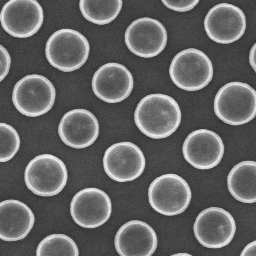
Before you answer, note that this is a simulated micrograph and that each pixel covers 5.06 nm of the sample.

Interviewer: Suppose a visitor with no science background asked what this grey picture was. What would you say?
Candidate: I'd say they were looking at a regular array of raised bodies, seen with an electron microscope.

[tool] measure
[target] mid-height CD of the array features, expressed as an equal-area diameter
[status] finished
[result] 39.1 px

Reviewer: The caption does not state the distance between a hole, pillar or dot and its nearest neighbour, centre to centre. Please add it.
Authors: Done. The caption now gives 0.283 micrometres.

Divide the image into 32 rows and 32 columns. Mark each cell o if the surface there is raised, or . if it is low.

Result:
.oooo.....ooooo......ooo........
ooooo.....ooooo...........oooo..
ooooo......ooo...oo.......ooooo.
.oooo...........oooo......ooooo.
..o....ooo......ooooo.....oooo..
......ooooo.....ooooo...........
o.....ooooo......ooo...oo......o
o.....ooooo...........oooo.....o
o......oo....ooo.....ooooo......
o...o.......oooo.....ooooo......
..oooo......oooo......oooo...o..
..ooooo.....oooo...........ooooo
..ooooo......oo...ooo......ooooo
..oooo...........ooooo.....ooooo
........oooo.....ooooo.....ooooo
........oooo.....ooooo..........
oo......oooo......ooo...oo......
oo......oooo...........oooo.....
oo............ooo......ooooo....
oo...........ooooo.....ooooo....
....oooo.....ooooo......ooo...oo
...ooooo.....ooooo...........ooo
...ooooo.......o....ooo......ooo
....oooo...........oooo......ooo
.........oooo......ooooo.....ooo
ooo......ooooo.....oooo.........
oooo.....ooooo......oo...ooo....
oooo.....oooo............oooo...
oooo...........oooo.....ooooo...
ooo....o.......oooo......oooo...
.....oooo......oooo......ooo...o
.....ooooo.....oooo...........oo